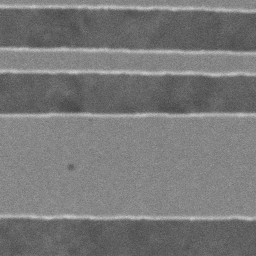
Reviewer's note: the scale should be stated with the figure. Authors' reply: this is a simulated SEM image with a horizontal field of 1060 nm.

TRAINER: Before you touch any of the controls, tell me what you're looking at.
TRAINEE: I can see lines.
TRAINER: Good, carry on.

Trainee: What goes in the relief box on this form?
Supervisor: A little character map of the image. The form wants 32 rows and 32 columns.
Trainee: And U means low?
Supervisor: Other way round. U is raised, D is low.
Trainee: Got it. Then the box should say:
UUUUUUUUUUUUUUUUUUUUUUUUUUUUUUUU
DDDDDDDDDDDDDDDDDDDDDDDDDDDDDDDD
DDDDDDDDDDDDDDDDDDDDDDDDDDDDDDDD
DDDDDDDDDDDDDDDDDDDDDDDDDDDDDDDD
DDDDDDDDDDDDDDDDDDDDDDDDDDDDDDDD
DDDDDDDDDDDDDDDDDDDDDDDDDDDDDDDD
UUUUUUUUUUUUUUUUUUUUUUUDDUDUDDDD
UUUUUUUUUUUUUUUUUUUUUUUUUUUUUUUU
UUUUUUUUUUUUUUUUUUUUUUUUUUUUUUUU
DDDDDDDDDDDDDDDDDDDDDDDDDDDDDDDD
DDDDDDDDDDDDDDDDDDDDDDDDDDDDDDDD
DDDDDDDDDDDDDDDDDDDDDDDDDDDDDDDD
DDDDDDDDDDDDDDDDDDDDDDDDDDDDDDDD
DDDDDDDDDDDDDDDDDDDDDDDDDDDDDDDD
UUUUUUUUUUUUUUUUUUUUUUUUUUUUUUUU
UUUUUUUUUUUUUUUUUUUUUUUUUUUUUUUU
UUUUUUUUUUUUUUUUUUUUUUUUUUUUUUUU
UUUUUUUUUUUUUUUUUUUUUUUUUUUUUUUU
UUUUUUUUUUUUUUUUUUUUUUUUUUUUUUUU
UUUUUUUUUUUUUUUUUUUUUUUUUUUUUUUU
UUUUUUUUUUUUUUUUUUUUUUUUUUUUUUUU
UUUUUUUUUUUUUUUUUUUUUUUUUUUUUUUU
UUUUUUUUUUUUUUUUUUUUUUUUUUUUUUUU
UUUUUUUUUUUUUUUUUUUUUUUUUUUUUUUU
UUUUUUUUUUUUUUUUUUUUUUUUUUUUUUUU
UUUUUUUUUUUUUUUUUUUUUUUUUUUUUUUU
UUUUUUUUUUUUUUUUUUUUUUUUUUUUUUUU
DDDDDDDDDDDDDDDDDDDDDDDDDDDDDDDD
DDDDDDDDDDDDDDDDDDDDDDDDDDDDDDDD
DDDDDDDDDDDDDDDDDDDDDDDDDDDDDDDD
DDDDDDDDDDDDDDDDDDDDDDDDDDDDDDDD
DDDDDDDDDDDDDDDDDDDDDDDDDDDDDDDD